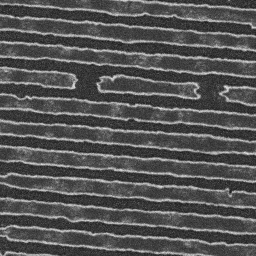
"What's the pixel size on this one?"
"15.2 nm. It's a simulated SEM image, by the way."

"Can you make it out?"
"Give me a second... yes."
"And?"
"parallel lines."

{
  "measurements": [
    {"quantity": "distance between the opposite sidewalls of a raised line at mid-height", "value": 226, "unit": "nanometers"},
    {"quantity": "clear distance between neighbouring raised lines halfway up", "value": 182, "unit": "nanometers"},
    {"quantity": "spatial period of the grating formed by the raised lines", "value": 398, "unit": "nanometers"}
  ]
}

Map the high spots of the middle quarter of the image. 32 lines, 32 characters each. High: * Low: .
..............**.***************
........................********
*...............................
***......********.*.............
***......***************........
***......***********************
.........***********************
....................**..********
................................
******..........................
*****************.**............
********************************
..*..***************************
............*.******************
........................********
*****...........................
************....................
*****************************...
********************************
........************************
.................***************
.............................*.*
*****...........................
******************..............
*****************************...
********************************
..............******************
...........................*****
*...............................
***********.**..................
***********************.........
********************************